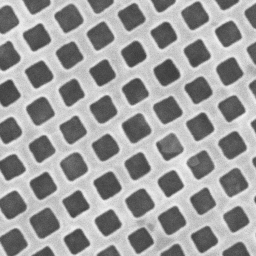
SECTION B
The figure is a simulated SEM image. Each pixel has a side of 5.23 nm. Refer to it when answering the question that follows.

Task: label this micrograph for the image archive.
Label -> a regular array of holes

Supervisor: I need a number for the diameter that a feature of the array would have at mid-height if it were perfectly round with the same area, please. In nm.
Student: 134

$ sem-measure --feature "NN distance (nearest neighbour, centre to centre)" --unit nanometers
190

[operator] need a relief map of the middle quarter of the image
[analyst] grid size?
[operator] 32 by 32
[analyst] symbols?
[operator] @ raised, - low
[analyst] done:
---@@@@-----@@@@--@@@@@-----@@@@
@@@@@@------@@@@@@@@@@-------@@@
@@@@@@-------@@@@@@@@@@------@@@
@@@@@@@------@@@@@-@@@@------@@@
@---@@@@----@@@@----@@@@----@@@@
----@@@@--@@@@@-----@@@@@-@@@@--
-----@@@@@@@@@-------@@@@@@@@@--
-----@@@@@@@@@@------@@@@@@@@@@-
-----@@@@---@@@------@@@@---@@@-
---@@@@-----@@@@---@@@@-----@@@@
--@@@@-------@@@@@@@@@-------@@@
@@@@@@-------@@@@@@@@@--------@@
@@@@@@@------@@@@@-@@@@-------@@
@@--@@@@----@@@@----@@@@-----@@@
----@@@@---@@@@------@@@---@@@@-
-----@@@@@@@@@-------@@@@@@@@@@-
------@@@@@@@@@-------@@@@@@@@@-
------@@@@-@@@@------@@@@@--@@@@
-----@@@@----@@@----@@@@@----@@@
@--@@@@------@@@@--@@@@------@@@
@@@@@@@-------@@@@@@@@@-------@@
@@@@@@@-------@@@@@@@@@-------@@
@---@@@@-----@@@@@--@@@@-----@@@
-----@@@@---@@@@-----@@@@--@@@@-
------@@@@@@@@@------@@@@@@@@@@-
------@@@@@@@@@-------@@@@@@@@@-
------@@@@@@@@@@------@@@@@-@@@@
-----@@@@@---@@@-----@@@@---@@@@
@---@@@@-----@@@@--@@@@@-----@@@
@@@@@@@-------@@@@@@@@@-------@@
@@@@@@@@------@@@@@@@@@@------@@
@@@-@@@@------@@@@---@@@-----@@@